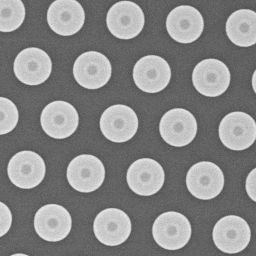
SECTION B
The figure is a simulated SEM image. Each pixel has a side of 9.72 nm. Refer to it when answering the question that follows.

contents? an array of small figures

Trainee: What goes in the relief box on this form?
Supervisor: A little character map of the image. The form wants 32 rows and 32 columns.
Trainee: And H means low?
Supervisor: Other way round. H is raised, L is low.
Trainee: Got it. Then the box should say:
HHHLLLHHHHLLLLHHHLLLLLLLLLLLLLLL
HHHLLLHHHHHLLLHHHHLLLHHHHLLLLHHH
HHHLLLHHHHHLLHHHHHLLLHHHHLLLHHHH
HHLLLLHHHHLLLLHHHHLLLHHHHLLLHHHH
LLLLLLLLLLLLLLHHHLLLLHHHHLLLHHHH
LLLLLLLLLLLLLLLLLLLLLLLLLLLLLHHH
LLLHHHLLLLLHLLLLLLLLLLLLLLLLLLLL
LLHHHHLLLLHHHHLLLHHHHLLLLLHLLLLL
LLHHHHLLLHHHHHLLLHHHHLLLHHHHLLLL
LLHHHHLLLHHHHHLLLHHHHLLLHHHHHLLL
LLLHHLLLLLHHHLLLLHHHHLLLHHHHHLLL
LLLLLLLLLLLLLLLLLLHHLLLLLHHHLLLL
HLLLLLLLLLLLLLLLLLLLLLLLLLLLLLLL
HHLLLLHHHLLLLLHHLLLLLLLLLLLLLLLL
HHLLLHHHHHLLLHHHHLLLHHHHLLLLHHHL
HHLLLHHHHHLLLHHHHLLLHHHHHLLHHHHH
HLLLLLHHHLLLLHHHHLLLHHHHHLLHHHHH
LLLLLLLLLLLLLLHHLLLLLHHHLLLLHHHH
LLLLLLLLLLLLLLLLLLLLLLLLLLLLLHHL
LLHHHLLLLLHHLLLLLLLLLLLLLLLLLLLL
LHHHHHLLLHHHHLLLLHHHLLLLHHHLLLLL
LHHHHHLLHHHHHLLLHHHHLLLLHHHHLLLH
LHHHHLLLHHHHHLLLHHHHLLLHHHHHLLLH
LLLHLLLLLHHHLLLLHHHHLLLHHHHHLLLH
LLLLLLLLLLLLLLLLLLLLLLLLHHHLLLLH
LLLLLLLLLLLLLLLLLLLLLLLLLLLLLLLL
HLLLLHHHLLLLLHHLLLLLLHLLLLLLLLLL
HLLLHHHHHLLLHHHHLLLHHHHLLLLHHHHL
HLLLHHHHHLLLHHHHLLLHHHHHLLLHHHHL
LLLLLHHHLLLLHHHHLLLHHHHHLLLHHHHL
LLLLLLLLLLLLLHHLLLLLHHHLLLLHHHHL
LLLLLLLLLLLLLLLLLLLLLLLLLLLLHHLL